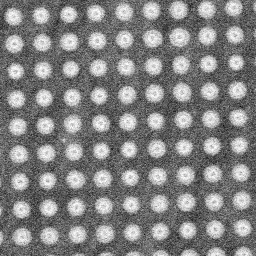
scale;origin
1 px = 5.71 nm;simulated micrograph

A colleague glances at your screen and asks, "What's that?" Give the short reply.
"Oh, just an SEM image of an array of small figures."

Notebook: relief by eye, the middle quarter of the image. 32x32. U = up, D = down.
UUUUDDDUUUDDDUUUUDDDUUUUDDDUUUUD
UUUUDDDUUUDDDDUUUDDDDUUUDDDUUUUD
UUUDDDDUUUDDDDUUUDDDDUUDDDDDDDDD
DDDDDDDDDDDDDDDDDDDDDDDDDDDDDDDD
DDDDDDDDDDDDDDDDDDDDDDDDDDDDDDDD
DDDDDDDDDDDDDDDDDDDDDUUUDDDDUUUD
DUUDDDDDUUDDDDUUUUDDDUUUUDDUUUUU
UUUUDDDUUUUDDDUUUUDDUUUUUDDUUUUU
UUUUDDDUUUUDDDUUUUDDDUUUDDDDUUUD
UUUUDDDUUUDDDDDUUDDDDDDDDDDDDDDD
DDDDDDDDDDDDDDDDDDDDDDDDDDDDDDDD
DDDDDDDDDDDDDDDDDDDDDDDDDDDDDDDD
DDDDDDDDDDDDDDDDDDDDDDUUDDDDUUUD
DUUUDDDDUUUDDDUUUUDDDUUUUDDDUUUU
UUUUDDDUUUUDDDUUUUDDDUUUUDDDUUUU
UUUUDDDUUUUDDDUUUUDDDUUUUDDDUUUD
DUUUDDDDUUUDDDDUUDDDDDDDDDDDDDDD
DDDDDDDDDDDDDDDDDDDDDDDDDDDDDDDD
DDDDDDDDDDDDDDDDDDDDDDDDDDDDDDDD
DDDDDDDDDDDDDDDDDDDDDDUUUDDDDUUD
DUUUDDDDUUUDDDDUUUDDDUUUUDDDUUUU
UUUUUDDUUUUDDDUUUUDDDUUUUDDDUUUU
UUUUUDDDUUUDDDDUUUDDDUUUUDDDDUUD
DUUUDDDDUUDDDDDDDDDDDDDDDDDDDDDD
DDDDDDDDDDDDDDDDDDDDDDDDDDDDDDDD
DDDDDDDDDDDDDDDDDDDDDDDDDDDDDDDD
DDDDDDDDDDDDDDDDDDDDDDUUUDDDDUUU
DUUUDDDDUUUDDDDUUUDDDUUUUUDDUUUU
DUUUUDDDUUUUDDDUUUUDDUUUUUDDUUUU
DUUUUDDDUUUUDDDUUUDDDDUUUDDDDUUU
DUUUDDDDUUUDDDDDDDDDDDDDDDDDDDDD
DDDDDDDDDDDDDDDDDDDDDDDDDDDDDDDD